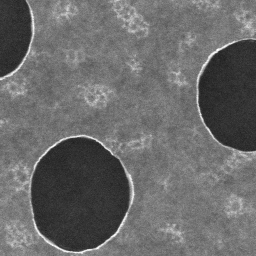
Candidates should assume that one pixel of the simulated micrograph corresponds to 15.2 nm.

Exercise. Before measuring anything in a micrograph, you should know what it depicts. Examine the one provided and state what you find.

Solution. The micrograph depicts holes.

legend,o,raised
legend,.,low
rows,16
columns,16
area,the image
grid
..oooooooooooooo
..oooooooooooooo
..ooooooooooooo.
..ooooooooooo...
.oooooooooooo...
oooooooooooo....
oooooooooooo....
ooooooooooooo...
ooooooooooooo...
ooo....ooooooooo
oo......oooooooo
oo......oooooooo
oo......oooooooo
oo......oooooooo
oo.....ooooooooo
oooo..oooooooooo